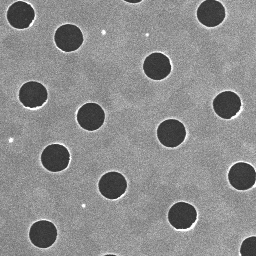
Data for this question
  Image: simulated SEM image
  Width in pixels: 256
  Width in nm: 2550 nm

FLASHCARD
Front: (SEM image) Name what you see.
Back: a regular array of holes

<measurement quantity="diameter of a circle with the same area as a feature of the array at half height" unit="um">0.278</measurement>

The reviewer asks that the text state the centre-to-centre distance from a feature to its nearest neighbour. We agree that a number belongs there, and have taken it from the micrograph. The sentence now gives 62.4 px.